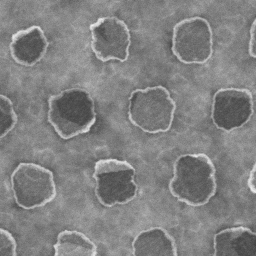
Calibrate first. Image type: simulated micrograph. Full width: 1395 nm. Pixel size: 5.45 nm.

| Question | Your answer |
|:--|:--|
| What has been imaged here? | a regular array of raised bodies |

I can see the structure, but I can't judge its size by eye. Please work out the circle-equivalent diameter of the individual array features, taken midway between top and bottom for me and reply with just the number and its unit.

0.241 micrometres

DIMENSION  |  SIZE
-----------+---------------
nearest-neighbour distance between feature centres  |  79 px